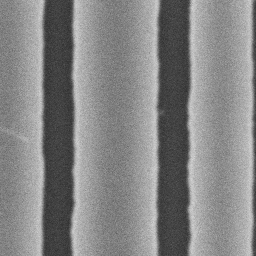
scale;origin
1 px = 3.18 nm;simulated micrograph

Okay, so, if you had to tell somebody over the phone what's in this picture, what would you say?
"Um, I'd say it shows lines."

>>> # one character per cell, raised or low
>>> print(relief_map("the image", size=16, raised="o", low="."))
ooo..ooooo..oooo
ooo..ooooo..oooo
ooo..ooooo..oooo
ooo..ooooo..oooo
ooo..ooooo..oooo
ooo..ooooo..oooo
ooo..ooooo..oooo
ooo..ooooo..oooo
ooo..ooooo..oooo
ooo..ooooo..oooo
ooo..ooooo..oooo
ooo..ooooo..oooo
ooo..ooooo..oooo
ooo..ooooo..oooo
ooo.oooooo..oooo
ooo..ooooo..oooo